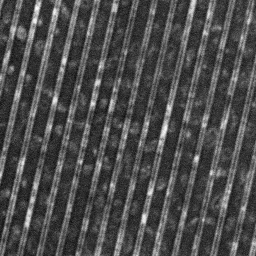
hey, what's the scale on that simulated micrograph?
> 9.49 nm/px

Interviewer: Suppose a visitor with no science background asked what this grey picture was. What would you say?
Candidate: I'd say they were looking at parallel lines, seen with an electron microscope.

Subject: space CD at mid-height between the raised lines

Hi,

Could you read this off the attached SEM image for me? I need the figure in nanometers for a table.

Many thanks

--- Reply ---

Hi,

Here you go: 136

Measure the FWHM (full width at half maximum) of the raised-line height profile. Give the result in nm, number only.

40.5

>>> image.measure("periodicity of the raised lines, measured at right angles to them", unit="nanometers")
179